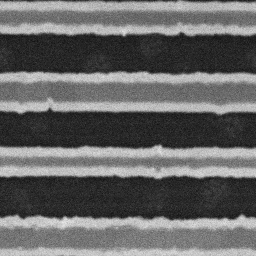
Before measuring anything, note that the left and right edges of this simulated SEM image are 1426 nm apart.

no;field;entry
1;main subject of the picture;one or a few lines or trenches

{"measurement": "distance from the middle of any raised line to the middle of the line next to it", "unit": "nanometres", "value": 408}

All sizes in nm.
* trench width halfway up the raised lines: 263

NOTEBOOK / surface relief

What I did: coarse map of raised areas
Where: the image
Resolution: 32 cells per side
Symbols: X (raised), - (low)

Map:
--------------------------------
XXXXXXXXXXXXXXXXXXXXXXXXXXXXXXXX
XXXXXXXXXXXXXXXXXXXXXXXXXXXXXXXX
XXXXXXXXXXXXXXXXXXXXXXXXXXXXXXXX
--------------------------------
--------------------------------
--------------------------------
--------------------------------
--------------------------------
--------------------------------
XXXXXXXXXXXXXXXXXXXXXXXXXXXXXXXX
XXXXXXXXXXXXXXXXXXXXXXXXXXXXXXXX
XXXXXXXXXXXXXXXXXXXXXXXXXXXXXXXX
--XX----------------------XXXXX-
--------------------------------
--------------------------------
--------------------------------
--------------------------------
--------------------------------
XXXXXXXXXXXXXXXXXXXXXXXXXXXXXXXX
XXXXXXXXXXXXXXXXXXXXXXXXXXXXXXXX
---X----XXXXX--XX-XXXX--XX-XXXXX
--------------------------------
--------------------------------
--------------------------------
--------------------------------
--------------------------------
--------------------------------
XXXXXXXXXXXXXXXXXXXXXXXXXXXXXXXX
XXXXXXXXXXXXXXXXXXXXXXXXXXXXXXXX
XXXXXXXXXXXXXXXXXXXXXXXXXXXXXXXX
XXXXXXXXXXXXXXXXXXXXXXXXXXXXXXXX